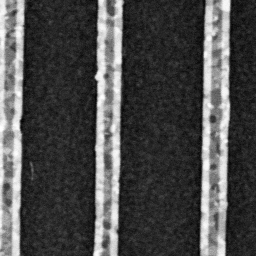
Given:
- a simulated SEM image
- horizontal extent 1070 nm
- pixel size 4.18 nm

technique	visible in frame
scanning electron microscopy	one or a few lines or trenches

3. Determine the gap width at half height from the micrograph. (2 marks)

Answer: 364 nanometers